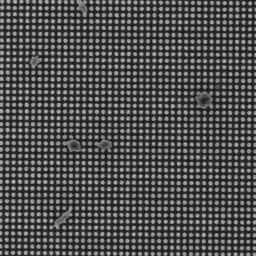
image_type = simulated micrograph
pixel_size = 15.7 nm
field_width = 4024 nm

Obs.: a regular array of raised bodies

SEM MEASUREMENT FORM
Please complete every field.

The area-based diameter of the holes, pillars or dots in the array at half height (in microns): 0.0615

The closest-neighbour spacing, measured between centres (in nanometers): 93.3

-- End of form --